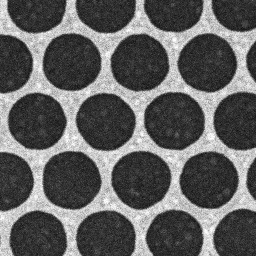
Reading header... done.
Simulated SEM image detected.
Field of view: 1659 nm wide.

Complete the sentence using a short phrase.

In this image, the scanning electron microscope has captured a regular array of holes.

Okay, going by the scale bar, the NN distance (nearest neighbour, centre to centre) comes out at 440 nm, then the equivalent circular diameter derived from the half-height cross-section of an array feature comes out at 384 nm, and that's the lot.